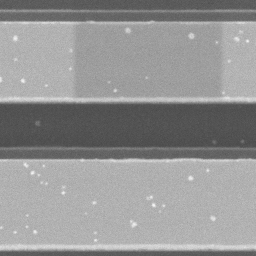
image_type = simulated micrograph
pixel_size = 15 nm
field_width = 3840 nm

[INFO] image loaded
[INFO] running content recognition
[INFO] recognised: lines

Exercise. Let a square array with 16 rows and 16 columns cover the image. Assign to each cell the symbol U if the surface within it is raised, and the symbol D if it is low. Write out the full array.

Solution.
DDDDDDDDDDDDDDDD
UUUUUUUUUUUUUUUU
UUUUUUUUUUUUUUUU
UUUUUUUUUUUUUUUU
UUUUUUUUUUUUUUUU
UUUUUUUUUUUUUUUU
DDDDDDDDDDDDDDDD
DDDDDDDDDDDDDDDD
DDDDDDDDDDDDDDDD
DDDDDDDDDDDDDDDD
UUUUUUUUUUUUUUUU
UUUUUUUUUUUUUUUU
UUUUUUUUUUUUUUUU
UUUUUUUUUUUUUUUU
UUUUUUUUUUUUUUUU
UUUUUUUUUUUUUUUU